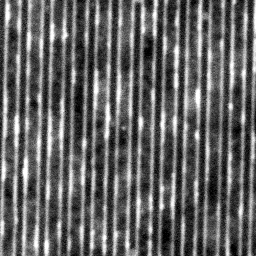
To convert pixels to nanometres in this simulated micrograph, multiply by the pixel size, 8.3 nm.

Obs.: parallel lines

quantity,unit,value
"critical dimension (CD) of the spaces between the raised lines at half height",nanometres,70.5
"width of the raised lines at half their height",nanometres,118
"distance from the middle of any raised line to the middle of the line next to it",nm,188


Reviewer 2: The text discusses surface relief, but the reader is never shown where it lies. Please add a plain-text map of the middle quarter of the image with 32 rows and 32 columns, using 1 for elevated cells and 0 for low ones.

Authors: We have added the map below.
00111000111000111001111001110001
00111000111000111001111001110001
00111000111000111001111001110001
00111000111000111001110001110001
00111000111000111001110001110001
00111000111000111001110001110001
00111000111000111001110001110011
00111000111000111001110001110011
00111000111001111001110001110011
00111000111001111001110001110011
00111000111000111001110001110011
00111000111000111001110001110011
00111000111000111001110001110011
00111000111001111001110001110011
00111000111001111001110011110011
00111000111001111001110011110011
00111001111001110001110001110011
00111001111001110001110001110011
00111001111001110001110001110011
00111101111001110001110011110011
00111001111001110001110011110011
00111001111001110001110011110011
00111001111001110001110011110011
00111001111001110001110011110011
00111001111001110001110011110011
00111001111001110001110011110011
00111001111001110001110011110011
00111001111001110001110011110011
00111001111001110001110011110011
00111001110001110001110011110011
00111001110001110001110011110011
00111001110001110001110011110011